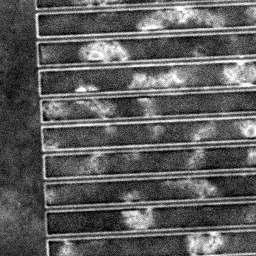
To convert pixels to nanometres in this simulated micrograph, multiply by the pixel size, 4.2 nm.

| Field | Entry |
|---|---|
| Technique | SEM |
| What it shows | parallel lines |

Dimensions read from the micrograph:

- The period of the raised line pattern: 119 nm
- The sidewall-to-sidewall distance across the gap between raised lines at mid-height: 0.0953 microns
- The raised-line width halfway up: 22 nm